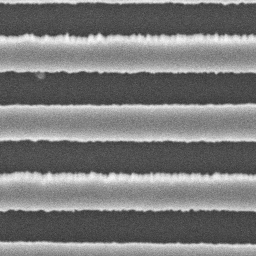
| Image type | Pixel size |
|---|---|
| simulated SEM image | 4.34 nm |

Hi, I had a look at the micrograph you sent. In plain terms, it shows lines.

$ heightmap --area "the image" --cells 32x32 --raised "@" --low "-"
----------------------------@---
--------------------------------
--------------------------------
--------------------------------
---@----@---@-@-----@-@-@@@@---@
@@@@@@@@@@@@@@@@@@@@@@@@@@@@@@@@
@@@@@@@@@@@@@@@@@@@@@@@@@@@@@@@@
@@@@@@@@@@@@@@@@@@@@@@@@@@@@@@@@
@@@@@@@@@@@@@@@@@@@@@@@@@@@@@@@@
--------------------------------
--------------------------------
--------------------------------
--------------------------------
@@@@@@@@@@@@@@@@@@@@@@@@@@@@@@@@
@@@@@@@@@@@@@@@@@@@@@@@@@@@@@@@@
@@@@@@@@@@@@@@@@@@@@@@@@@@@@@@@@
@@@@@@@@@@@@@@@@@@@@@@@@@@@@@@@@
@-@-@-@@@@@@@@@@@@@@@@@@@@@@@@@@
--------------------------------
--------------------------------
--------------------------------
--------------------------------
@@@@@@@@@@@@@@@@@@@@@@@@@@@@@@@@
@@@@@@@@@@@@@@@@@@@@@@@@@@@@@@@@
@@@@@@@@@@@@@@@@@@@@@@@@@@@@@@@@
@@@@@@@@@@@@@@@@@@@@@@@@@@@@@@@@
--------------------------------
--------------------------------
--------------------------------
--------------------------------
@@@@@@@@@@@@@@@@@@@@@@@-@@@-----
@@@@@@@@@@@@@@@@@@@@@@@@@@@@@@@@